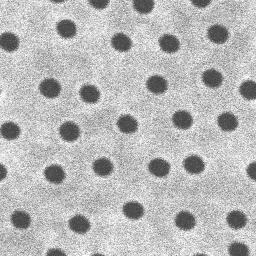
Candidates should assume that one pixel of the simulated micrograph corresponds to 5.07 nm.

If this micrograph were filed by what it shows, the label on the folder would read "a regular array of holes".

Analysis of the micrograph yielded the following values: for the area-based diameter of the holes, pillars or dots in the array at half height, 21.2 pixels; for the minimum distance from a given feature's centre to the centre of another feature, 227 nm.